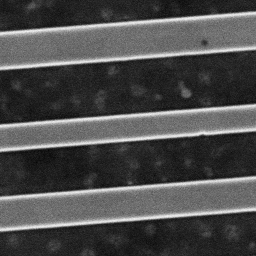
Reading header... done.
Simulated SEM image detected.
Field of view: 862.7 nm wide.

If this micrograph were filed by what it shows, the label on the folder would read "one or a few lines or trenches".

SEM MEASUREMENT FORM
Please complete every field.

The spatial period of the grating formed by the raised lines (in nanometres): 274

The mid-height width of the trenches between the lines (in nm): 173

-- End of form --